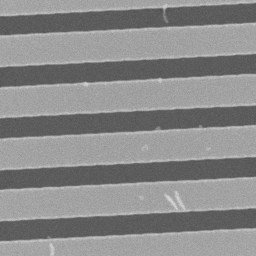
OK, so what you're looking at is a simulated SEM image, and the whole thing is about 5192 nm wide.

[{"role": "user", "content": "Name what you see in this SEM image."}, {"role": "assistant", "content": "lines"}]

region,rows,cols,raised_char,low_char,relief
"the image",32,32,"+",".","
++++++++++++++++++++++++++++....
+++++++++.......................
................................
....................++++++++++++
++++++++++++++++++++++++++++++++
++++++++++++++++++++++++++++++++
++++++++++++++++++++++++++++++++
++++++++++++++++++..............
................................
............................++++
.........+++++++++++++++++++++++
++++++++++++++++++++++++++++++++
++++++++++++++++++++++++++++++++
+++++++++++++++++++++++++.......
+++++...........................
................................
.................+++++++++++++++
++++++++++++++++++++++++++++++++
++++++++++++++++++++++++++++++++
++++++++++++++++++++++++++++++++
+++++++++++++++.................
................................
........................++++++++
.....+++++++++++++++++++++++++++
++++++++++++++++++++++++++++++++
++++++++++++++++++++++++++++++++
++++++++++++++++++++++..........
+++.............................
................................
.............+++++++++++++++++++
++++++++++++++++++++++++++++++++
++++++++++++++++++++++++++++++++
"